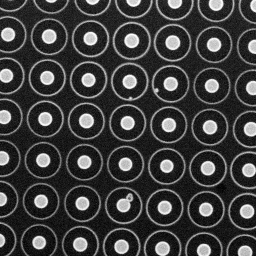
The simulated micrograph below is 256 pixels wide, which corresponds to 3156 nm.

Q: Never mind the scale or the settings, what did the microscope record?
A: an array of small figures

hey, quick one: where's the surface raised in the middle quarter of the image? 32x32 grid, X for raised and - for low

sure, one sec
XXXX-----XXXXX----XXXXXXXXXXXXXX
XXX-------XXX-------XXXX-----XXX
XX--------XX--------XXX-------XX
XX---XXX---X---XXX---XX---X----X
XX---XXX--XX---XXX---X---XXX---X
XX----X---XX---XXX---X---XXX---X
XXX-------XXX-------XXX---X----X
XXXX-----XXXX------XXXX-------XX
XXXXXXXXXXXXXXX-X-XXXXXX-----XXX
XXXXXXXXXXXXXXXXXXXXXXXXXXXXXXXX
XXX-----XXXXXXX--XXXXXXXXXXXXXXX
XX-------XXXX------XXXXX----XXXX
XX--------XX--------XXX-------XX
X---XXX---XX---XX---XX--------XX
X---XXX---XX--XXX---XX---XXX--XX
X---XXX---XX--XXX---XX---XXX---X
XX-------XXX--------XX---XX---XX
XXX------XXX-------XXX--------XX
XXXXX--XXXXXXX----XXXXX------XXX
XXXXXXXXXXXXXXXXXXXXXXXXX--XXXXX
XXXX--XXXXXXXXXXXXXXXXXXXXXXXXXX
XX------XXXXX-----XXXXXX---XXXXX
X--------XXX-------XXXX------XXX
X---XX---XX--------XXX-------XXX
X---XXX--XX---XXX---X----XX---XX
X---XX---XX---XXX---X---XXX---XX
X--------XX----X----X----XX---XX
XX------XXXX-------XXX--------XX
XXX----XXXXXX-----XXXXX------XXX
XXXXXXXXXXXXXXXXXXXXXXXX---XXXXX
XXXX-XXXXXXXXXXXXXXXXXXXXXXXXXXX
XX-----XXXXXX----XXXXXXXXXXXXXXX